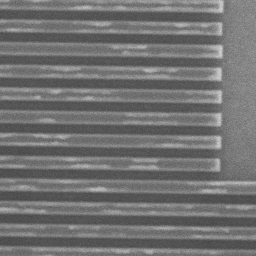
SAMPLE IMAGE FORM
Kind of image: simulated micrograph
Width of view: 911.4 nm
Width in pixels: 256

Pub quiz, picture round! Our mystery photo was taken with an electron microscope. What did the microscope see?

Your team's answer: parallel lines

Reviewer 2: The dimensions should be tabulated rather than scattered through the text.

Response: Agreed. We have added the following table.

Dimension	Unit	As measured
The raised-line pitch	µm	0.0807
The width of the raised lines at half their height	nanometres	42.3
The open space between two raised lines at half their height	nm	39.1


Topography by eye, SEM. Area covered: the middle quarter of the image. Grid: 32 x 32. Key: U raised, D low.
DDDDDDDDDDDDDDDDDDDDDDDDDDDDDDDD
UUUUUUUUUUUUUUUUUUUUUUUUUUUUUUUU
UUUUUUUUUUUUUUUUUUUUUUUUUUUUUUUU
DDDDDDDDDDDDUUUUUUUUUUUUUUUUUUUU
DDDDDDDDDDDDDDDDDDDDDDDDDDDDDDDD
DDDDDDDDDDDDDDDDDDDDDDDDDDDDDDDD
UUUUUUUUUUUUUDDDDDDDDDDDDDDDDDDD
UUUUUUUUUUUUUUUUUUUUUUUUUUUUUUUU
UUUUUUUUUUUUUUUUUUUUUUUUUUUUUUUU
DDDDDDDDDDDDDDDDDDDDDDDDDDDDDDDU
DDDDDDDDDDDDDDDDDDDDDDDDDDDDDDDD
DDDDDDDDDDDDDDDDDDDDDDDDDDDDDDDD
UUUUUUUUUUUUUUUUUUUUUUUUUUUUUUUU
UUUUUUUUUUUUUUUUUUUUUUUUUUUUUUUU
UUUUUUUUUUUUUUUUUUUUUUUUUUUUUUUU
DDDDDDDDDDDDDDDDDDDDDDDDDDDDDDDD
DDDDDDDDDDDDDDDDDDDDDDDDDDDDDDDD
DDDDDDDDDDDDDDDDDDDDDDDDDDDDDDDD
UUUUUUUUUUUUUUUUUUUUUUUUUUUUUUUU
UUUUUUUUUUUUUUUUUUUUUUUUUUUUUUUU
DDDDDDUUDDUDDDDDDDUUUUUUUUUUUUUU
DDDDDDDDDDDDDDDDDDDDDDDDDDDDDDDD
DDDDDDDDDDDDDDDDDDDDDDDDDDDDDDDD
UUUDDDDDDDDDDDDDDDDDDDDDDDDDDDDD
UUUUUUUUUUUUUUUUUUUUUUUUUUUUUUUU
UUUUUUUUUUUUUUUUUUUUUUUUUUUUUUUU
DDDDDDDDDDDDDDDDDDDDDDDDDDDDDDDD
DDDDDDDDDDDDDDDDDDDDDDDDDDDDDDDD
DDDDDDDDDDDDDDDDDDDDDDDDDDDDDDDD
UUUUUUUUUUUUUUUUUUUUUUUUUUUUDDDD
UUUUUUUUUUUUUUUUUUUUUUUUUUUUUUUU
UUUUUUUUUUUUUUUUUUUUUUUUUUUUUUUU